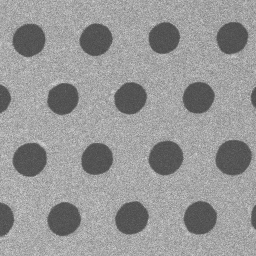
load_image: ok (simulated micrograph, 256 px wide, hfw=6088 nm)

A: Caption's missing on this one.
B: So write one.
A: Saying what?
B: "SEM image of a regular array of holes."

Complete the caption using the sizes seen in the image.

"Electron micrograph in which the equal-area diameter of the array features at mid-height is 789 nanometers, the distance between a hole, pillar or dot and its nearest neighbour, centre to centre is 1610 nm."